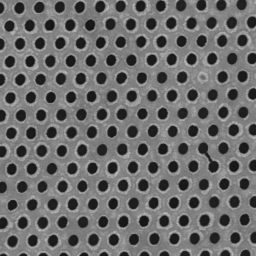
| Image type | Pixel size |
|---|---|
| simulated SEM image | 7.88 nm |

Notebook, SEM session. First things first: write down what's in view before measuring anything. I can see a regular array of holes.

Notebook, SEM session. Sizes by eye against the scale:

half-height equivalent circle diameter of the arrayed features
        83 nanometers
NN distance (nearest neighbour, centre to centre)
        158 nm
